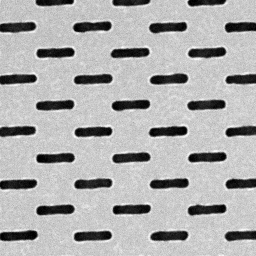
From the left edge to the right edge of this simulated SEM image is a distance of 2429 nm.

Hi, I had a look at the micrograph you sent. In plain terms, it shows a regular array of holes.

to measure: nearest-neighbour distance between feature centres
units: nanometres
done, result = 432